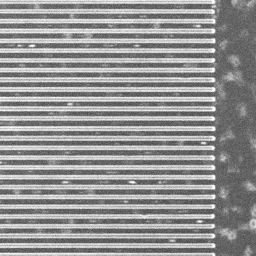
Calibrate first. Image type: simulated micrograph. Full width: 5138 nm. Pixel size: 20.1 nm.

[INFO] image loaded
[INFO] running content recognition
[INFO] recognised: parallel lines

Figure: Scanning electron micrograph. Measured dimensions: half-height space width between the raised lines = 125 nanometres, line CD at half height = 72.8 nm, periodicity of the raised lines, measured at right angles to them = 196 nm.